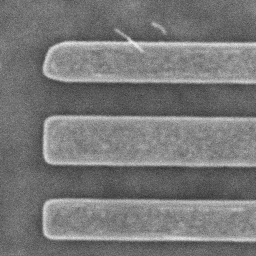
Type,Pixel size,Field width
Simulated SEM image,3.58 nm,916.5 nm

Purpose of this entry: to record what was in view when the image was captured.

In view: wiring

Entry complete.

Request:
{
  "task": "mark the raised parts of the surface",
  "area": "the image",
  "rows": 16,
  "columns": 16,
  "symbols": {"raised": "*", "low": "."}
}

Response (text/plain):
................
................
................
...*************
...*************
................
................
...*************
...*************
...*************
................
................
...***..........
...*************
...*************
................